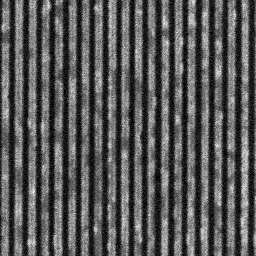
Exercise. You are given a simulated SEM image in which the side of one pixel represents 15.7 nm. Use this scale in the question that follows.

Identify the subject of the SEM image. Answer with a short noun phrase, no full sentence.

parallel lines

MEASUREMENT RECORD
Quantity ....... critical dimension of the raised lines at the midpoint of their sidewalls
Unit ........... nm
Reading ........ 94.3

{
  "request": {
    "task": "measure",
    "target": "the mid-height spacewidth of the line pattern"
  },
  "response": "110 nanometers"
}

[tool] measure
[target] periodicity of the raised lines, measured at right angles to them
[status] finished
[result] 209 nm